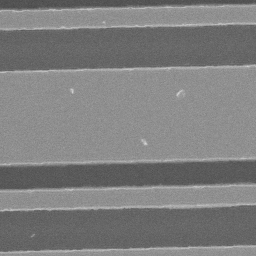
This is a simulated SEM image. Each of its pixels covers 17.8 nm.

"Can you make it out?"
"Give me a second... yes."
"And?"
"lines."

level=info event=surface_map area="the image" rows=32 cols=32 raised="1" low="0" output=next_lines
00000000000000000000000000000000
11111111111111111111111111111111
11111111111111111111111111111111
11111000000000000000000000000000
00000000000000000000000000000000
00000000000000000000000000000000
00000000000000000000000000000000
00000000000000000000000000000000
00000000000000000000000001111111
11111111111111111111111111111111
11111111111111111111111111111111
11111111111111111111111111111111
11111111111111111111111111111111
11111111111111111111111111111111
11111111111111111111111111111111
11111111111111111111111111111111
11111111111111111111111111111111
11111111111111111111111111111111
11111111111111111111111111111111
11111111111111111111111111111111
11000000000000000000000000000000
00000000000000000000000000000000
00000000000000000000000000000000
00000000000000000011111111111111
11111111111111111111111111111111
11111111111111111111111111111101
00000000000000000000000000000000
00000000000000000000000000000000
00000000000000000000000000000000
00000000000000000000000000000000
00000000000000000000000000000000
00011111111111111111111111111111